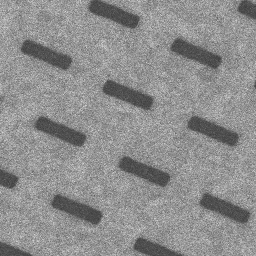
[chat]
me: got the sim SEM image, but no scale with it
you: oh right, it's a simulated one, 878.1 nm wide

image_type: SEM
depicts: a regular array of holes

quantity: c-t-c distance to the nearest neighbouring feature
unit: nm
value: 266